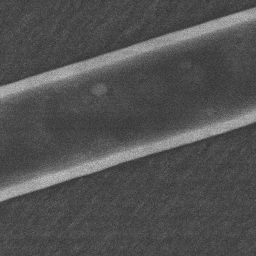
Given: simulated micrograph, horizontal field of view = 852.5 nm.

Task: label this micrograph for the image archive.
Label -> one or a few lines or trenches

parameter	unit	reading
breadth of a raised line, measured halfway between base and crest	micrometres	0.33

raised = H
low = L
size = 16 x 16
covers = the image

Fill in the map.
LLLLLLLLLLLLLLLL
LLLLLLLLLLLLLLHH
LLLLLLLLLLHHHHHH
LLLLLLLHHHHHHHHH
LLLLHHHHHHHHHHHH
LHHHHHHHHHHHHHHH
HHHHHHHHHHHHHHHH
HHHHHHHHHHHHHHHL
HHHHHHHHHHHHLLLL
HHHHHHHHHLLLLLLL
HHHHHHLLLLLLLLLL
HHLLLLLLLLLLLLLL
LLLLLLLLLLLLLLLL
LLLLLLLLLLLLLLLL
LLLLLLLLLLLLLLLL
LLLLLLLLLLLLLLLL